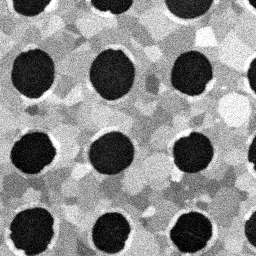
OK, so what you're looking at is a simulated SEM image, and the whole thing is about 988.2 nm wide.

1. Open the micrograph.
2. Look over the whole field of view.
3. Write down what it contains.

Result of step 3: a regular array of holes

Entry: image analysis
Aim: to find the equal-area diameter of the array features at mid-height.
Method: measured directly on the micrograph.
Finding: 166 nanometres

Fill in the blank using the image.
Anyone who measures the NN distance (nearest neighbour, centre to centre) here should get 305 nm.